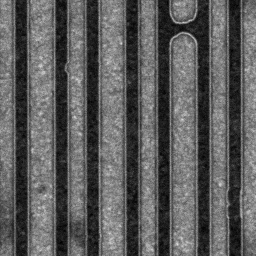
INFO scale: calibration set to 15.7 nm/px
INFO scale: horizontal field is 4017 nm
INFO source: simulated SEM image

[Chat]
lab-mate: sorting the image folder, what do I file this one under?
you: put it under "parallel lines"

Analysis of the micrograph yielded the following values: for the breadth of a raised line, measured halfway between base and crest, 224 nm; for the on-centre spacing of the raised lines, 35.6 px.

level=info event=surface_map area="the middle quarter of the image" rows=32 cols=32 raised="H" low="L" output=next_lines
LLLLLHHHHLLLLLLHHHHLLLLHHHLLLLLL
LLLLLHHHHLLLLLLHHHHLLLLHHHLLLLLL
HLLLLHHHHLLLLLLHHHHLLLLHHHHLLLLL
HLLLLHHHHLLLLLLHHHHLLLLHHHLLLLLL
HLLLLHHHHLLLLLLHHHHLLLLHHHHLLLLL
HLLLLLHHHLLLLLLHHHHLLLLHHHHLLLLL
HLLLLLHHHLLLLLLHHHHLLLLHHHHLLLLL
HLLLLLHHHLLLLLLHHHHLLLLHHHHLLLLL
HLLLLLHHHLLLLLLHHHHLLLLHHHHLLLLL
HLLLLLHHHLLLLLLHHHHLLLLHHHHLLLLL
HLLLLLHHHLLLLLLHHHHLLLLHHHHLLLLL
HLLLLLHHHLLLLLLHHHHLLLLHHHHLLLLL
HLLLLLHHHLLLLLLHHHHLLLLHHHHLLLLL
HLLLLLHHHLLLLLLHHHHLLLLHHHHLLLLL
HLLLLLHHHLLLLLLHHHHLLLLHHHHLLLLL
HLLLLLHHHLLLLLLHHHHLLLLHHHHLLLLL
HLLLLLHHHLLLLLLHHHHLLLLHHHHLLLLL
HLLLLLHHHLLLLLLHHHHLLLLHHHHLLLLL
HLLLLLHHHLLLLLLHHHHLLLLHHHHLLLLL
HLLLLLHHHLLLLLLHHHHLLLLHHHHLLLLL
HLLLLLHHHLLLLLLHHHHLLLLHHHHLLLLL
HLLLLLHHHLLLLLLHHHHLLLLHHHHLLLLL
HLLLLLHHHLLLLLLHHHHLLLLHHHHLLLLL
HLLLLLHHHLLLLLLHHHHLLLLHHHHLLLLL
HLLLLLHHHLLLLLLHHHHLLLLHHHHLLLLL
HLLLLLHHHLLLLLLHHHHLLLLHHHHLLLLL
HLLLLLHHHLLLLLLHHHHLLLLHHHHLLLLL
HLLLLLHHHLLLLLLHHHHLLLLHHHHLLLLL
HLLLLLHHHLLLLLLHHHHLLLLHHHHLLLLL
HLLLLLHHHLLLLLLHHHHLLLLHHHHLLLLL
HLLLLLHHHLLLLLLHHHHLLLLHHHHLLLLL
HLLLLLHHHLLLLLLHHHHLLLLHHHHLLLLL